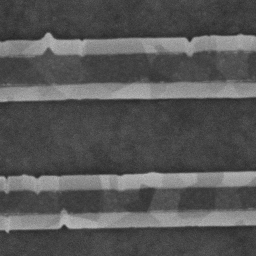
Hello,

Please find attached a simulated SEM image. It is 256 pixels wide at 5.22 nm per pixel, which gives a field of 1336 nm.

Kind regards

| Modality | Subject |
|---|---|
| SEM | one or a few lines or trenches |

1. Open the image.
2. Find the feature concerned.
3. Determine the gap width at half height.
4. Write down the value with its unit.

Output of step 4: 459 nanometers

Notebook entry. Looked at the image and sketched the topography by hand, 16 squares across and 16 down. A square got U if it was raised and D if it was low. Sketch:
DDDDDDDDDDDDDDDD
DDDDDDDDDDDDDDDD
DDDDDDDDDDDDDDDD
UUUUUUUUUUUUUUUU
UUUUUUUUUUUUUUUU
UUUUUUUUUUUUUUUU
DDDDDDDDDDDDDDDD
DDDDDDDDDDDDDDDD
DDDDDDDDDDDDDDDD
DDDDDDDDDDDDDDDD
DDDDDDDDDDDDDDDD
UUUUUUUUUUUUUUUU
UUUUUUUUUUUUUUUU
UUUUUUUUUUUUUUUU
DDDDDDDDDDDDDDDD
DDDDDDDDDDDDDDDD